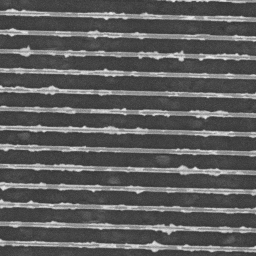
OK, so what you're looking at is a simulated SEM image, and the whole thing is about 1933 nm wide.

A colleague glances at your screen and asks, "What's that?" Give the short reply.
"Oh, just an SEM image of parallel lines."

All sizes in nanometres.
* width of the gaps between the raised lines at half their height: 108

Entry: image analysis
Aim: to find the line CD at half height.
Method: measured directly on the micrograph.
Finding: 33.5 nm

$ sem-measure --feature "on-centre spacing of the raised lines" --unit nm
145